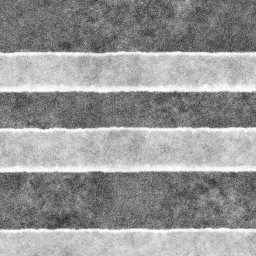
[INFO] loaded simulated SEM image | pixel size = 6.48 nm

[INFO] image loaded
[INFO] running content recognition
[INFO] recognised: lines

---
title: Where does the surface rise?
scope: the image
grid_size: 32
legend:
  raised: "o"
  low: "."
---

................................
................................
................................
................................
................................
................................
................................
oooooooooooooooooooooooooooooooo
oooooooooooooooooooooooooooooooo
oooooooooooooooooooooooooooooooo
oooooooooooooooooooooooooooooooo
................................
................................
................................
................................
................................
oooooooooooooooooooooooooooooooo
oooooooooooooooooooooooooooooooo
oooooooooooooooooooooooooooooooo
oooooooooooooooooooooooooooooooo
oooooooooooooooooooooooooooooooo
................................
................................
................................
................................
................................
................................
................................
................................
oooooooooooooooooooooooooooooooo
oooooooooooooooooooooooooooooooo
oooooooooooooooooooooooooooooooo